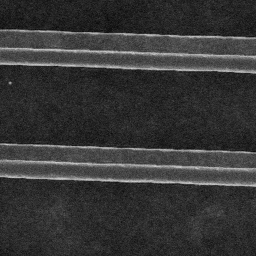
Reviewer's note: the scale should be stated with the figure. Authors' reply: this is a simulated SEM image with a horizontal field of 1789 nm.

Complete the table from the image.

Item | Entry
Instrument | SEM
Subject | lines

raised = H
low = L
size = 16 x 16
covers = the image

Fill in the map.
LLLLLLLLLLLLLLLL
LLLLLLLLLLLLLLLL
HHHHHHHHHHHHHHHH
HHHHHHHHHHHHHHHH
LLLLLLLLLLLLLLLH
LLLLLLLLLLLLLLLL
LLLLLLLLLLLLLLLL
LLLLLLLLLLLLLLLL
LLLLLLLLLLLLLLLL
HHHHHHHHHHHHHHLL
HHHHHHHHHHHHHHHH
LLLLLLLLLLLLLHHH
LLLLLLLLLLLLLLLL
LLLLLLLLLLLLLLLL
LLLLLLLLLLLLLLLL
LLLLLLLLLLLLLLLL